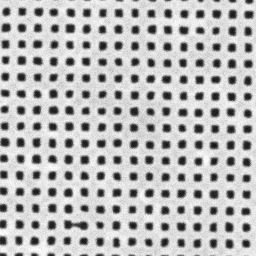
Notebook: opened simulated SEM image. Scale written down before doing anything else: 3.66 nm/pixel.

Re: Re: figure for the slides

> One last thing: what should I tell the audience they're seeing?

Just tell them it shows a regular array of holes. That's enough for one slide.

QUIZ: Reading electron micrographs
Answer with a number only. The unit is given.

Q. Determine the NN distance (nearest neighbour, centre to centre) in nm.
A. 57.6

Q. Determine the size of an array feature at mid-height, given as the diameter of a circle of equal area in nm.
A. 34